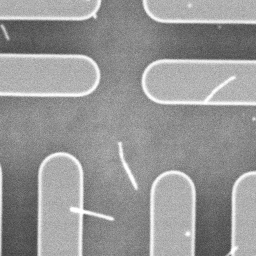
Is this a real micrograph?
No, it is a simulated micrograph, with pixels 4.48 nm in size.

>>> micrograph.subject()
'groups of lines, slits or small figures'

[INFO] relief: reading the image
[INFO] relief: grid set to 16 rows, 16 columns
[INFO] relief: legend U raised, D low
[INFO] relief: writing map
UUUUUUDDDUUUUUUU
DDDDDDDDDDDDDDDD
DDDDDDDDDDDDDDDD
UUUUDDDDDDDDDDDD
UUUUUUDDDUUUUUUU
UUUUUUDDDUUUUUUU
DDDDDDDDDDDDDDDD
DDDDDDDDDDDDDDDD
DDDDDDDDDDDDDDDD
DDDDDDDDDDDDDDDD
DDDUUDDDDDDDDDDD
DDUUUDDDDDUUDDDU
DDUUUDDDDUUUDDDU
DDUUUDDDDUUUDDDU
DDUUUDDDDUUUDDDU
DDUUUDDDDUUUDDUU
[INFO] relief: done